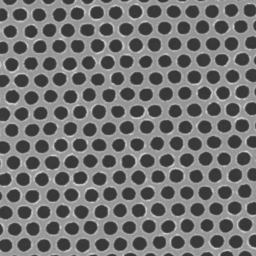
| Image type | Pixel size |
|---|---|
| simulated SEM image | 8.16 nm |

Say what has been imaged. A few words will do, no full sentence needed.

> a regular array of holes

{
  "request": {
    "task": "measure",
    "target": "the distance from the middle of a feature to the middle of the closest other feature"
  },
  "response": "149 nanometres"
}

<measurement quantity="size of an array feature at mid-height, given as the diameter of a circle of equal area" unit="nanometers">113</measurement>